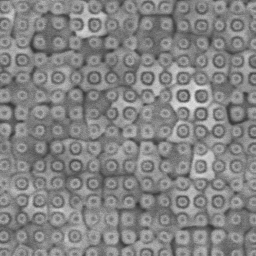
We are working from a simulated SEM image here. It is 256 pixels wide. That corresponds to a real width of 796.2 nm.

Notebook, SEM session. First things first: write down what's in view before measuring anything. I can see a regular array of raised bodies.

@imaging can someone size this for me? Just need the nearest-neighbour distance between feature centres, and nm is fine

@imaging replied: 53.5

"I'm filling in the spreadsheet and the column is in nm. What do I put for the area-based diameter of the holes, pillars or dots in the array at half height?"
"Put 27.8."